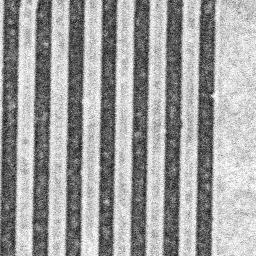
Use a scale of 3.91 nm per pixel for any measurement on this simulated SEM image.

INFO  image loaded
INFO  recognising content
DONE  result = parallel lines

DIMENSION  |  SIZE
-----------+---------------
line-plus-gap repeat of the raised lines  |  128 nm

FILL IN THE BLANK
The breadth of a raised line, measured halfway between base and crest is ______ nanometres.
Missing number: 49.8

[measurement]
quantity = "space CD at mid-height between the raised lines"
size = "77.1 nanometers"